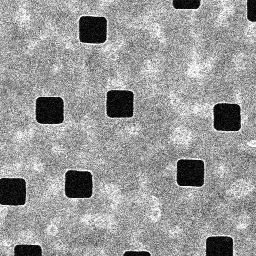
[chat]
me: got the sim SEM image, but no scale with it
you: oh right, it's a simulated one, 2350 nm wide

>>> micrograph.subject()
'holes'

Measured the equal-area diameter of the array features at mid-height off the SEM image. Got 282 nm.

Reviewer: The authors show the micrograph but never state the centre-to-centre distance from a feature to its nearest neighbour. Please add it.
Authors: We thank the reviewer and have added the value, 0.647 micrometres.